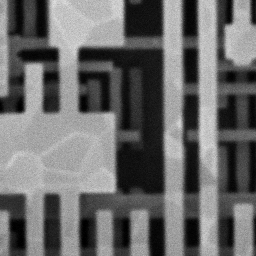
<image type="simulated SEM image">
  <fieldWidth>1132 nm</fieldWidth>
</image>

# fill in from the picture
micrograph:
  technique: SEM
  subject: wiring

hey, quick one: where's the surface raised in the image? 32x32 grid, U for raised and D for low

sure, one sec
UDDDDDUUUUUUUUUDDDDDUUUDDUUDDUUD
UDDDDDUUUUUUUUUDDDDDUUUDDUUDDUUD
UDDDDDUUUUUUUUUDDDDDUUUDDUUDDUUD
UDDDDDUUUUUUUUUDDDDDUUUDDUUDUUUU
UDDDDDUUUUUUUUUDDDDDUUUDDUUDUUUU
UDDDDDUUUUUUUUUDDDDDUUUDDUUDUUUU
UDDDDDDUUUDDDDDDDDDDUUUDDUUDUUUU
UDDDDDDUUUDDDDDDDDDDDUUDDUUDDUUU
UDDUUDDUUUDDDDDDDDDDDUUDDUUDDDDD
UDDUUDDUUUDDDDDDDDDDDUUDDUUDDDDD
UDDUUDDUUUDDDDDDDDDDUUUDDUUDDDDD
UDDUUDDUUUDDDDDDDDDDUUUDDUUDDDDD
DDDUUDDUUUDDDDDDDDDDDUUDDUUDDDDD
DDDUUDDUUUDDDDDDDDDDDUUDDUUDDDDD
UUUUUUUUUUUUUUDDDDDDDUUDDUUDDDDD
UUUUUUUUUUUUUUDDDDDDDUUDDUUDDDDD
UUUUUUUUUUUUUUDDDDDDDUUDDUUDDDDD
UUUUUUUUUUUUUUDDDDDDDUUDDUUDDDDD
UUUUUUUUUUUUUUDDDDDDDUUDDUUDDDDD
UUUUUUUUUUUUUUDDDDDDDUUDDUUDDDDD
UUUUUUUUUUUUUUDDDDDDDUUDDUUDDDDD
UUUUUUUUUUUUUUDDDDDDDUUDDUUDDDDD
UUUUUUUUUUUUUUDDDDDDDUUDDUUDDDDD
UUUUUUUUUUUUUUDDDDDDDUUDDUUDDDDD
DDDUUUDUUUDDDDDDDDDDDUUDDUUDDDDD
DDDUUDDDUUDDDDDDDDDDDUUDDUUDDDDD
UDDUUDDDUUDDUUDDDUDDDUUDDUUDDUUU
UDDUUDDDUUDDUUDDUUUDDUUDDUUDDUUU
UDDUUDDDUUDDUUDDUUUDDUUDDUUDDUUU
UDDUUDDDUUDDUUDDUUUDDUUDDUUDDUUU
UDDUUDDDUUDDUUDDUUDDDUUDDUUDDUUU
UDDUUDDDUUDDUUDDUUUDDUUDDUUDDUUU